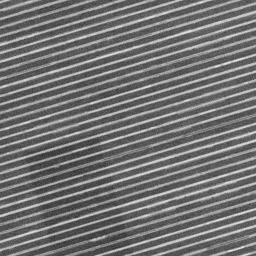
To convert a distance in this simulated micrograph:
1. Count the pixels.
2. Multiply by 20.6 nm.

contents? parallel lines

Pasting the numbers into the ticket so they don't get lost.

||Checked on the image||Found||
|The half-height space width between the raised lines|134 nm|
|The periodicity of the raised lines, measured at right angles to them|8.22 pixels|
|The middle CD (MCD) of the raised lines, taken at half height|37.1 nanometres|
